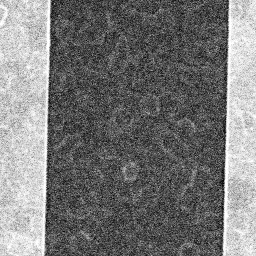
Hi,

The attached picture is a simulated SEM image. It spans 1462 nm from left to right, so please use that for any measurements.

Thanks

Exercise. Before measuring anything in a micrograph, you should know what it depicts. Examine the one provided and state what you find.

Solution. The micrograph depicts one or a few lines or trenches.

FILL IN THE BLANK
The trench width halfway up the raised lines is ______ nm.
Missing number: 1030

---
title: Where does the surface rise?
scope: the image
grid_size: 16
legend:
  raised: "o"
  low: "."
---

ooo...........oo
ooo...........oo
ooo...........oo
ooo...........oo
ooo...........oo
ooo...........oo
ooo...........oo
ooo...........oo
ooo...........oo
ooo...........oo
ooo...........oo
ooo...........oo
ooo...........oo
ooo...........oo
ooo...........oo
ooo...........oo